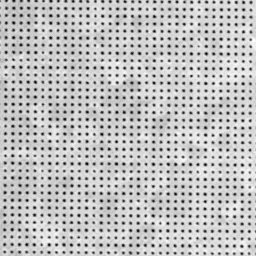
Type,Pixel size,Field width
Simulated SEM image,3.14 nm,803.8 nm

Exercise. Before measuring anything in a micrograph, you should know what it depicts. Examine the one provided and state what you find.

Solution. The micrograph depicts a regular array of holes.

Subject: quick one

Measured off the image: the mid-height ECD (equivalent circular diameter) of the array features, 10 nm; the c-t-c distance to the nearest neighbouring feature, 22.4 nm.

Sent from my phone